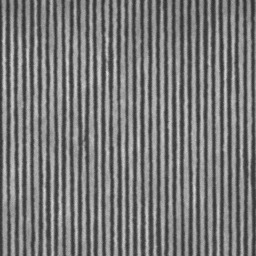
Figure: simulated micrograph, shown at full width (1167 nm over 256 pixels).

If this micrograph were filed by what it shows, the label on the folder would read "parallel lines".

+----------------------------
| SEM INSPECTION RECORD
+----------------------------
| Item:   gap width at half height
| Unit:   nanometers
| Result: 22.2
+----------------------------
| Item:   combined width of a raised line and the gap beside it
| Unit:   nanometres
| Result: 36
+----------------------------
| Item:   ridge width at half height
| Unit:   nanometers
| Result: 13.1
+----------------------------